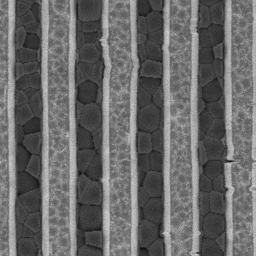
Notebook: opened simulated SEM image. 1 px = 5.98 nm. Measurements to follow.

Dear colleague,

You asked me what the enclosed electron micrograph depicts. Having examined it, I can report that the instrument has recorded one or a few lines or trenches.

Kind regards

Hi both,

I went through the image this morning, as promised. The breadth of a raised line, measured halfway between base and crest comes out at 27.1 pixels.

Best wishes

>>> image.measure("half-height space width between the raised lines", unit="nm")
203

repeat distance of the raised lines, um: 0.365